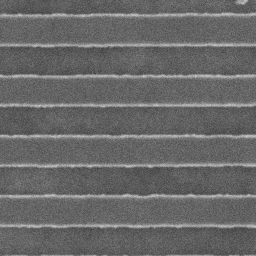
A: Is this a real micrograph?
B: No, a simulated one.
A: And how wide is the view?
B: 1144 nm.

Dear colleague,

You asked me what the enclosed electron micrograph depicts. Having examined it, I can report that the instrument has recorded lines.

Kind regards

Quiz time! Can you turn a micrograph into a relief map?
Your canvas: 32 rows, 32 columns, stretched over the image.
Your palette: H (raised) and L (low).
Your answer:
LLLLLLLLLLLLLLLLLLLLLLLLLLLLLLLL
LLLLLLLLLLLLLLLLLLLLLLLLLLLLLLLL
HHHHHHHHHHHHHHHHHHHHHHHHHHHHHHHH
HHHHHHHHHHHHHHHHHHHHHHHHHHHHHHHH
HHHHHHHHHHHHHHHHHHHHHHHHHHHHHHHH
HHHHHHHHHHHHHHHHHHHHHHHHHHHHHHHH
LLLLLLLLLLLLLLLLLLLLLLLLLLLLLLLL
LLLLLLLLLLLLLLLLLLLLLLLLLLLLLLLL
LLLLLLLLLLLLLLLLLLLLLLLLLLLLLLLL
HHHHHLLLLHHHHHHHHHHHHHHHHHHHLHHH
HHHHHHHHHHHHHHHHHHHHHHHHHHHHHHHH
HHHHHHHHHHHHHHHHHHHHHHHHHHHHHHHH
HHHHHHHHHHHHHHHHHHHHHHHHHHHHHHHH
LLLLLLLLLLLLLLLLLLLLLLLLLLLLLLLL
LLLLLLLLLLLLLLLLLLLLLLLLLLLLLLLL
LLLLLLLLLLLLLLLLLLLLLLLLLLLLLLLL
LLLLLLLLLLLLLLLLLLLLLLLLLLLLLLLL
HHHHHHHHHHHHHHHHHHHHHHHHHHHHHHHH
HHHHHHHHHHHHHHHHHHHHHHHHHHHHHHHH
HHHHHHHHHHHHHHHHHHHHHHHHHHHHHHHH
HHHHHHHHHHHHHHHHHHHHHHHHHHHHHHHH
LLLLLLLLLLLLLLLLLLLLLLLLLLLLLLLL
LLLLLLLLLLLLLLLLLLLLLLLLLLLLLLLL
LLLLLLLLLLLLLLLLLLLLLLLLLLLLLLLL
HHHHHHHHHHHHHHHHHHHHHHHHHHHHHHHH
HHHHHHHHHHHHHHHHHHHHHHHHHHHHHHHH
HHHHHHHHHHHHHHHHHHHHHHHHHHHHHHHH
HHHHHHHHHHHHHHHHHHHHHHHHHHHHHHHH
LLLLLLLLLLLLLLLLLLLLLLLLLLLLLLLL
LLLLLLLLLLLLLLLLLLLLLLLLLLLLLLLL
LLLLLLLLLLLLLLLLLLLLLLLLLLLLLLLL
LLLLLLLLLLLLLLLLLLLLLLLLLLLLLLLL